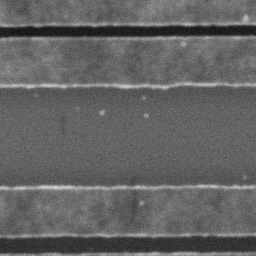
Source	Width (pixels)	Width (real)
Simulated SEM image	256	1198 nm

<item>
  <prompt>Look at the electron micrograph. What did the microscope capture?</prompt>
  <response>lines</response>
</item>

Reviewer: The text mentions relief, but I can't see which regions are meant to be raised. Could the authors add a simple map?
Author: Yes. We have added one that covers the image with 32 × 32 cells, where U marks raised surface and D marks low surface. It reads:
UUUUUUUUUUUUUUUUUUUUUUUUUUUUUUUU
UUUUUUUUUUUUUUUUUUUUUUUUUUUUUUUU
UUUUUUUUUUUUUUUUUUUUUUUUUUUUUUUU
DDDDDDDDDDDDDDDDDDDDDDDDDDDDDDDD
DDDDDDDDDDDDDDDDDDDDDDDDDDDDDDDD
UUUUUUUUUUUUUUUUUUUUUUUUUUUUUUUU
UUUUUUUUUUUUUUUUUUUUUUUUUUUUUUUU
UUUUUUUUUUUUUUUUUUUUUUUUUUUUUUUU
UUUUUUUUUUUUUUUUUUUUUUUUUUUUUUUU
UUUUUUUUUUUUUUUUUUUUUUUUUUUUUUUU
UUUUUUUUUUUUUUUUUUUUUUUUUUUUUUUU
DDDDDDDDDDDDDDDDDDDDDDDDDDDDDDDD
DDDDDDDDDDDDDDDDDDDDDDDDDDDDDDDD
DDDDDDDDDDDDDDDDDDDDDDDDDDDDDDDD
DDDDDDDDDDDDDDDDDDDDDDDDDDDDDDDD
DDDDDDDDDDDDDDDDDDDDDDDDDDDDDDDD
DDDDDDDDDDDDDDDDDDDDDDDDDDDDDDDD
DDDDDDDDDDDDDDDDDDDDDDDDDDDDDDDD
DDDDDDDDDDDDDDDDDDDDDDDDDDDDDDDD
DDDDDDDDDDDDDDDDDDDDDDDDDDDDDDDD
DDDDDDDDDDDDDDDDDDDDDDDDDDDDDDDD
DDDDDDDDDDDDDDDDDDDDDDDDDDDDDDDD
DDDDDDDDDDDDDDDDDDDDDDDDDDDDDDDD
UUUUUUUUUUUUUUUUUUUUUUUUUUUUUUUU
UUUUUUUUUUUUUUUUUUUUUUUUUUUUUUUU
UUUUUUUUUUUUUUUUUUUUUUUUUUUUUUUU
UUUUUUUUUUUUUUUUUUUUUUUUUUUUUUUU
UUUUUUUUUUUUUUUUUUUUUUUUUUUUUUUU
UUUUUUUUUUUUUUUUUUUUUUUUUUUUUUUU
UUUUDDDDDDUDDUDDDDDUDDDDDDDDDDDD
DDDDDDDDDDDDDDDDDDDDDDDDDDDDDDDD
DDDDDDDDDDDDDDDDDDDDDDDDDDDDDDDD